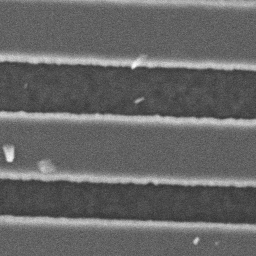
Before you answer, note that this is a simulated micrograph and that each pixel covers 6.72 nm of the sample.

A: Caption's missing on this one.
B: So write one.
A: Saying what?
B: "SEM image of lines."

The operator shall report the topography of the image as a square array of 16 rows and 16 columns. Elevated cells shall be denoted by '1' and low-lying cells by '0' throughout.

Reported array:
1111111111111111
1111111111111111
1111111111111111
1111111111111111
0000000000000000
0000000000000000
0000000000000000
1111111111111100
1111111111111111
1111111111111111
1111111111111111
0000000000001111
0000000000000000
0000000000000000
1111111111111111
1111111111111111